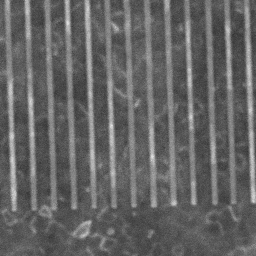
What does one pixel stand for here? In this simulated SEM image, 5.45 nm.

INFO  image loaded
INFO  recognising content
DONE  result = parallel lines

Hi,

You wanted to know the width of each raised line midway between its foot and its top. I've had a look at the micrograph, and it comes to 23.8 nanometers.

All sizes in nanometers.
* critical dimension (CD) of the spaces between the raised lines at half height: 85.1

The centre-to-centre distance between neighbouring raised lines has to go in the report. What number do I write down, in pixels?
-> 20